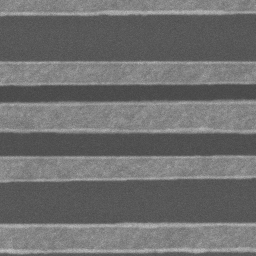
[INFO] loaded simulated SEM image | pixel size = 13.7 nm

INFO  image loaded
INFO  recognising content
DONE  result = lines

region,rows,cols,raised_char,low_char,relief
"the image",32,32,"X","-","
XXXXXXXXXXXXXXXXXXXXXXXXXXXXXXXX
XXXXXXXXXXXXXXXXXXXXXXXXXXXXXXXX
--------------------------------
--------------------------------
--------------------------------
--------------------------------
--------------------------------
--------------------------------
XXXXXXXXXXXXXXXXXXXXXXXXXXXXXXXX
XXXXXXXXXXXXXXXXXXXXXXXXXXXXXXXX
XXXXXXXXXXXXXXXX-XX-------------
--------------------------------
--------------------------------
XXXXXXXXXXXXXXXXXXXXXXXXXXXXXXXX
XXXXXXXXXXXXXXXXXXXXXXXXXXXXXXXX
XXXXXXXXXXXXXXXXXXXXXXXXXXXXXXXX
--------------------------------
--------------------------------
--------------------------------
-----------------------------X--
XXXXXXXXXXXXXXXXXXXXXXXXXXXXXXXX
XXXXXXXXXXXXXXXXXXXXXXXXXXXXXXXX
XXXXXX--------------------------
--------------------------------
--------------------------------
--------------------------------
--------------------------------
--------------------------------
XXXXXXXXXXXXXXXXXXXXXXXXXXXXXXXX
XXXXXXXXXXXXXXXXXXXXXXXXXXXXXXXX
XXXXXXXXXXXXXXXXXXXXXXXXXXXXXXXX
-----X--------------------------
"